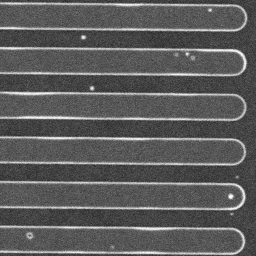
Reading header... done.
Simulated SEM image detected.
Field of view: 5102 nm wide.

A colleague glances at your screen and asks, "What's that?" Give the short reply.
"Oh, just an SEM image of groups of lines, slits or small figures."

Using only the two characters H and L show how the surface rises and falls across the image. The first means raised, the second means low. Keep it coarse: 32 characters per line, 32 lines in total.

HHHHHHHHHHHLLLLLLLLLLLLLLLLLLLLL
HHHHHHHHHHHHHHHHHHHHHHHHHHHHHHHL
HHHHHHHHHHHHHHHHHHHHHHHHHHHHHHHL
HHHHHHHHHHHHHHHHHHHHHHHHHHHHHHLL
LLLLLLLLLLLLLLLLLLLLLLLLLLLLLLLL
LLLLLLLLLLLLLLLLLLLLLLLLLLLLLLLL
HHHHHHHHHHHHHHHHHHHHHHHHHHHHHHLL
HHHHHHHHHHHHHHHHHHHHHHHHHHHHHHHL
HHHHHHHHHHHHHHHHHHHHHHHHHHHHHHHL
LLLLLLLLLLLLLLLLLLLLLLLLLLLLLLLL
LLLLLLLLLLLLLLLLLLLLLLLLLLLLLLLL
LLLLLLLLLLLLLLLLLLLLLLLLLLLLLLLL
HHHHHHHHHHHHHHHHHHHHHHHHHHHHHHLL
HHHHHHHHHHHHHHHHHHHHHHHHHHHHHHHL
HHHHHHHHHHHHHHHHHHHHHHHHHHHHHHLL
LLLLLLLLLLLLLLLLLLLLLLLLLLLLLLLL
LLLLLLLLLLLLLLLLLLLLLLLLLLLLLLLL
HHHHHHHHHHHHHHHHHHHHHHHHHHHHHHLL
HHHHHHHHHHHHHHHHHHHHHHHHHHHHHHHL
HHHHHHHHHHHHHHHHHHHHHHHHHHHHHHHL
LLLLLLLLLLLLLLLLLLLLLLLLLLLLHLLL
LLLLLLLLLLLLLLLLLLLLLLLLLLLLLLLL
LLLLLLLLLLLLLLLLLLLLLLLLLLLLLLLL
HHHHHHHHHHHHHHHHHHHHHHHHHHHHHHLL
HHHHHHHHHHHHHHHHHHHHHHHHHHHHHHHL
HHHHHHHHHHHHHHHHHHHHHHHHHHHHHHLL
LLLLLLLLLLLLLLLLLLLLLLLLLLLLLLLL
LLLLLLLLLLLLLLLLLLLLLLLLLLLLLLLL
HHHHHHHHHHHHHHHHHLLLLLLLLLLLLLLL
HHHHHHHHHHHHHHHHHHHHHHHHHHHHHHLL
HHHHHHHHHHHHHHHHHHHHHHHHHHHHHHLL
LLLLHHHHHHHHHHHHHHHHHHHHHHHHHHLL